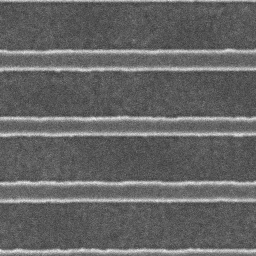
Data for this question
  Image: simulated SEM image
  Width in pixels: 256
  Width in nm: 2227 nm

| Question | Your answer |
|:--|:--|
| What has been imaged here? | lines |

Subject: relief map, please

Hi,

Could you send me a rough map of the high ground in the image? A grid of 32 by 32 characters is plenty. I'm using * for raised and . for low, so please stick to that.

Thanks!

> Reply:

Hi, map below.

................................
................................
................................
................................
................................
................................
********************************
********************************
********************************
................................
................................
................................
................................
................................
................................
********************************
********************************
................................
................................
................................
................................
................................
................................
********************************
********************************
................................
................................
................................
................................
................................
................................
********************************